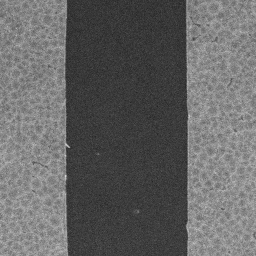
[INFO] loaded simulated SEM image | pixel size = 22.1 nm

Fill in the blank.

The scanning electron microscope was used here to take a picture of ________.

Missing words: one or a few lines or trenches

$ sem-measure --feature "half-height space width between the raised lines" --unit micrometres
2.7